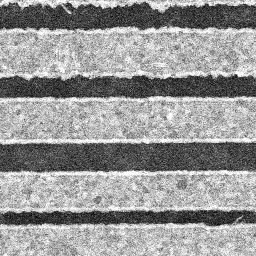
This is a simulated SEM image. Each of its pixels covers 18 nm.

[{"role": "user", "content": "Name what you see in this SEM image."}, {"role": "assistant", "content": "one or a few lines or trenches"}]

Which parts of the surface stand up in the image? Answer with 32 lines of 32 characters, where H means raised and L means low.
LLHLLLLLLHLLLHHHLLLHHHHHLLHLLLLL
LLLLLLLLLLLLLLLLLLLLLLLLLLLLLLLL
LLLLLLLLLLLLLLLLLLLLLLLLLLLLLLLL
LLLLLLLLLLLLLLLLLLLLLLLLLLLLLLLL
HHHHHHHHHHHHHHHHHHHHHHHHHHHHHHHH
HHHHHHHHHHHHHHHHHHHHHHHHHHHHHHHH
HHHHHHHHHHHHHHHHHHHHHHHHHHHHHHHH
HHHHHHHHHHHHHHHHHHHHHHHHHHHHHHHH
HHHHHHHHHHHHHHHHHHHHHHHHHHHHHHHH
LLLHLLLLHLLLLLLLLLLLHHLLLLLLLLLL
LLLLLLLLLLLLLLLLLLLLLLLLLLLLLLLL
LLLLLLLLLLLLLLLLLLLLLLLLLLLLLLLL
LLLHHHHLHHLHHLHHLLLHHHLHHLLHHHHH
HHHHHHHHHHHHHHHHHHHHHHHHHHHHHHHH
HHHHHHHHHHHHHHHHHHHHHHHHHHHHHHHH
HHHHHHHHHHHHHHHHHHHHHHHHHHHHHHHH
HHHHHHHHHHHHHHHHHHHHHHHHHHHHHHHH
HHHHHHHHHHHHHHLLHLHHHLHLLHLHHHHH
LLLLLLLLLLLLLLLLLLLLLLLLLLLLLLLL
LLLLLLLLLLLLLLLLLLLLLLLLLLLLLLLL
LLLLLLLLLLLLLLLLLLLLLLLLLLLLLLLL
LLLLLLLLLLLLLLLLLLLLLLLLLLLLLLLL
HHHHHHHHHHHHHHHHHHHHHHHHHHHHHHHH
HHHHHHHHHHHHHHHHHHHHHHHHHHHHHHHH
HHHHHHHHHHHHHHHHHHHHHHHHHHHHHHHH
HHHHHHHHHHHHHHHHHHHHHHHHHHHHHHHH
LLLLLLLLLLLLLLLLLLLLLLLLLLLLLLLL
LLLLLLLLLLLLLLLLLLLLLLLLLLLLLLLL
HHHHHHHHHHHHHHHHHHHHHHHHHHHHHHHH
HHHHHHHHHHHHHHHHHHHHHHHHHHHHHHHH
HHHHHHHHHHHHHHHHHHHHHHHHHHHHHHHH
HHHHHHHHHHHHHHHHHHHHHHHHHHHHHHHH